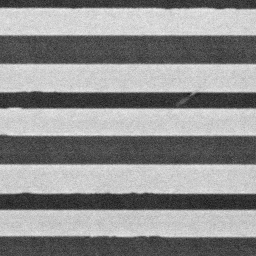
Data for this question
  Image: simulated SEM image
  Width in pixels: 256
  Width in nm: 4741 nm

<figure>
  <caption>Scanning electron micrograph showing lines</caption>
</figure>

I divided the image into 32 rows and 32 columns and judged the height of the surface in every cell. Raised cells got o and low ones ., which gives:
................................
oooooooooooooooooooooooooooooooo
oooooooooooooooooooooooooooooooo
oooooooooooooooooooooooooooooooo
................................
................................
................................
................................
oooooooooooooooooooooooooooooooo
oooooooooooooooooooooooooooooooo
oooooooooooooooooooooooooooooooo
.......................oo.......
................................
................................
oooooooooooooooooooooooooooooooo
oooooooooooooooooooooooooooooooo
oooooooooooooooooooooooooooooooo
................................
................................
................................
................................
oooooooooooooooooooooooooooooooo
oooooooooooooooooooooooooooooooo
oooooooooooooooooooooooooooooooo
................................
................................
oooooooooooooooooooooooooooooooo
oooooooooooooooooooooooooooooooo
oooooooooooooooooooooooooooooooo
...........o..ooo...oooooooooooo
................................
................................